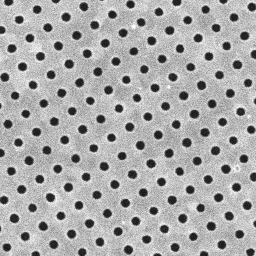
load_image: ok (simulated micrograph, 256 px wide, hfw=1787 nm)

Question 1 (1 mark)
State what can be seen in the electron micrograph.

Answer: a regular array of holes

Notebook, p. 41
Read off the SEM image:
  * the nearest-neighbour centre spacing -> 20.6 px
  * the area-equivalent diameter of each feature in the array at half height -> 62.3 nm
